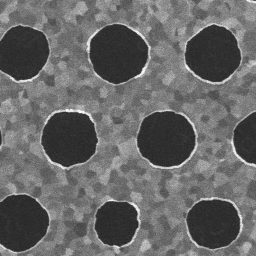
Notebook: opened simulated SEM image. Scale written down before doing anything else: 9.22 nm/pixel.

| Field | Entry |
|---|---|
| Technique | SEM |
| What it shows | holes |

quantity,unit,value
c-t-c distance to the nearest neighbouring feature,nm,891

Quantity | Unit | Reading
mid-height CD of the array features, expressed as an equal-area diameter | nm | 517